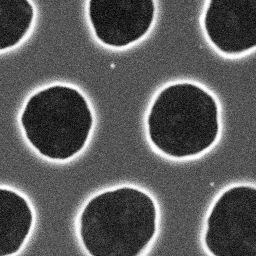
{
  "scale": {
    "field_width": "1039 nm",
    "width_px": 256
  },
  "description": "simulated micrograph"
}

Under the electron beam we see holes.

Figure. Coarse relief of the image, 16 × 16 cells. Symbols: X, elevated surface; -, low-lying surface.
--XXXX----XXX---
--XXXX---XXXX---
-XXXXX---XXXX---
XXXXXXXXXXXXXXXX
XXXXXXXXXXXXXXXX
XXX-XXXXXX--XXXX
XX---XXXXX---XXX
X-----XXX-----XX
XX----XXX----XXX
XX---XXXXX---XXX
XXXXXXXXXXXXXXXX
XXXXXXXXXXXXXXXX
--XXXX---XXXXX--
--XXX-----XXX---
--XXX-----XXX---
-XXXX----XXXX---